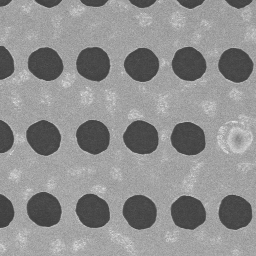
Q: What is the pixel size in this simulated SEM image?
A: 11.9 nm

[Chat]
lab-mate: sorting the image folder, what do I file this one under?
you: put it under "a regular array of holes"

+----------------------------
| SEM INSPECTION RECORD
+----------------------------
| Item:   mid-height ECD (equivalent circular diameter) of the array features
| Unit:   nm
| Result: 406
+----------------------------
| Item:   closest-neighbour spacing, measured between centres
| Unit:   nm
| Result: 562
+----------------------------